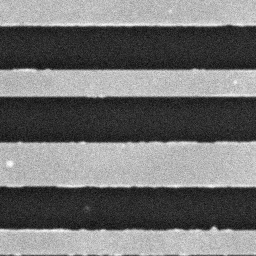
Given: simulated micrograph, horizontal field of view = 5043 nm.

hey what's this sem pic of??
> lines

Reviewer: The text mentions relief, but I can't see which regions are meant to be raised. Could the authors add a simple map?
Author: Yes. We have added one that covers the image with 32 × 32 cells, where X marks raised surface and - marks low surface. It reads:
XXXXXXXXXXXXXXXXXXXXXXXXXXXXXXXX
XXXXXXXXXXXXXXXXXXXXXXXXXXXXXXXX
XXXXXXXXXXXXXXXXXXXXXXXXXXXXXXXX
--------------------------------
--------------------------------
--------------------------------
--------------------------------
--------------------------------
--------------------------------
XXXXXXXXXXXXXXXXXXXXXXXXXXXXXXXX
XXXXXXXXXXXXXXXXXXXXXXXXXXXXXXXX
XXXXXXXXXXXXXXXXXXXXXXXXXXXXXXXX
--------------------------------
--------------------------------
--------------------------------
--------------------------------
--------------------------------
--------------------------------
XXXXXXXXXXXXXXXXXXXXXXXXXXXXXXXX
XXXXXXXXXXXXXXXXXXXXXXXXXXXXXXXX
XXXXXXXXXXXXXXXXXXXXXXXXXXXXXXXX
XXXXXXXXXXXXXXXXXXXXXXXXXXXXXXXX
XXXXXXXXXXXXXXXXXXXXXXXXXXXXXXXX
--------------------------------
--------------------------------
--------------------------------
--------------------------------
--------------------------------
--------------------------------
XXXXXXXXXXXXXXXXXXXXXXXXXXXXXXXX
XXXXXXXXXXXXXXXXXXXXXXXXXXXXXXXX
XXXXXXXXXXXXXXXXXXXXXXXXXXXXXXXX